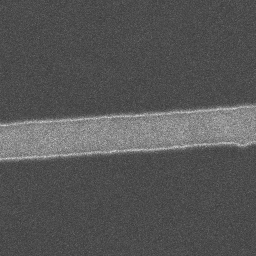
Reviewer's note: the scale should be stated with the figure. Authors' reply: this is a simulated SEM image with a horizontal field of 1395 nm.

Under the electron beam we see one or a few lines or trenches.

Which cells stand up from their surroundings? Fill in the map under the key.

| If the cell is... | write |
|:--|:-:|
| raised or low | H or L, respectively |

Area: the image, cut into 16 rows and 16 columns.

HHHHHHHHHHHHHHHH
HHHHHHHHHHHHHHHH
HHHHHHHHHHHHHHHH
HHHHHHHHHHHHHHHH
HHHHHHHHHHHHHHHH
HHHHHHHHHHHHHHHH
HHHHHHHHHHHHHHHH
HHHHHLLLLLLLLLLL
LLLLLLLLLLLLLLLL
LLLLLLHHHHHHHHHH
HHHHHHHHHHHHHHHH
HHHHHHHHHHHHHHHH
HHHHHHHHHHHHHHHH
HHHHHHHHHHHHHHHH
HHHHHHHHHHHHHHHH
HHHHHHHHHHHHHHHH